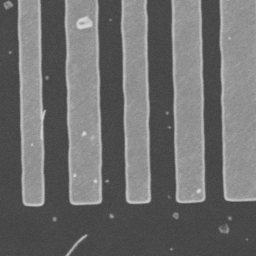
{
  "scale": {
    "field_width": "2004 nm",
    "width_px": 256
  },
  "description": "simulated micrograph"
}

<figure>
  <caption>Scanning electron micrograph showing groups of lines, slits or small figures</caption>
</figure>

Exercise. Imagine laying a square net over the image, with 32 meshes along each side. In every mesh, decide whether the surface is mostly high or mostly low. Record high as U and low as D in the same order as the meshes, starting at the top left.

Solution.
DDUUUDDDUUUUDDDUUUDDDDUUUDDDUUUU
DDUUUDDDUUUUDDDUUUDDDDUUUDDDUUUU
DDUUUDDDUUUUDDDUUUDDDDUUUDDDUUUU
DDUUUDDDUUUUDDDUUUDDDDUUUDDDUUUU
DDUUUDDDUUUUDDDUUUDDDDUUUDDDUUUU
DDUUUDDDUUUUDDDUUUDDDDUUUDDDUUUU
DDDUUDDDUUUUDDDUUUDDDDUUUDDDUUUU
DDDUUDDDUUUUDDDDUUDDDDUUUDDDUUUU
DDDUUDDDUUUUDDDDUUDDDDUUUDDDUUUU
DDDUUDDDUUUUDDDDUUDDDDUUUDDDUUUU
DDDUUDDDUUUUDDDUUUDDDDUUUDDDUUUU
DDDUUDDDUUUUDDDDUUDDDDUUUDDDUUUU
DDDUUDDDUUUUDDDDUUUDDDUUUDDDUUUU
DDDUUDDDDUUUDDDDUUUDDDUUUDDDUUUU
DDDUUDDDUUUUDDDDUUUDDDUUUDDDUUUU
DDDUUDDDUUUUDDDDUUDDDDUUUDDDUUUU
DDDUUDDDDUUUUDDDUUUDDDUUUDDDUUUU
DDDUUDDDDUUUUDDDUUUDDDUUUDDDUUUU
DDDUUDDDDUUUUDDDUUUDDDUUUDDDUUUU
DDDUUDDDDUUUUDDDUUUDDDUUUDDDUUUU
DDDUUDDDDUUUUDDDUUUDDDUUUUDDUUUU
DDDUUDDDDUUUUDDDUUUDDDUUUUDDUUUU
DDDUUDDDDUUUUDDDUUUDDDUUUUDDUUUU
DDDUUDDDDUUUUDDDUUUDDDUUUUDDUUUU
DDDUUDDDDUUUUDDDUUUDDDUUUUDDUUUU
DDDUUDDDDUUDDDDDDDDDDDDDDDDDDDDD
DDDDDDDDDDDDDDDDDDDDDDDDDDDDDDDD
DDDDDDDDDDDDDDDDDDDDDDDDDDDDDDDD
DDDDDDDDDDDDDDDDDDDDDDDDDDDDDDDD
DDDDDDDDDDDDDDDDDDDDDDDDDDDDDDDD
DDDDDDDDDDDDDDDDDDDDDDDDDDDDDDDD
DDDDDDDDDDDDDDDDDDDDDDDDDDDDDDDD